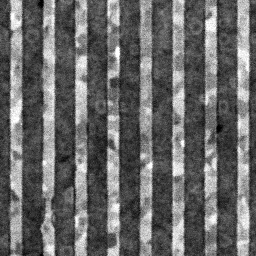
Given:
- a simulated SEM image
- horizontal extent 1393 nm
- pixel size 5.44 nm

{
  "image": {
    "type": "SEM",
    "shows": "parallel lines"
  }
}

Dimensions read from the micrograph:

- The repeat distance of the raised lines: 176 nanometres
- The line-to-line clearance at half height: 121 nm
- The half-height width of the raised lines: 57.8 nanometers